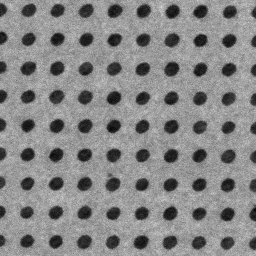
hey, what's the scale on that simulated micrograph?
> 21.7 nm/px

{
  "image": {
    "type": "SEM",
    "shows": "a regular array of holes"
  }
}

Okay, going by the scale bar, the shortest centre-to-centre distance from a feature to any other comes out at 619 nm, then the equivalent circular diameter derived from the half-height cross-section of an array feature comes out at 327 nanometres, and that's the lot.